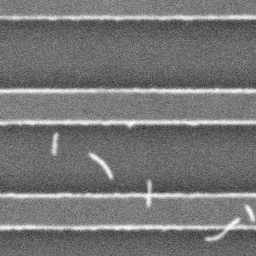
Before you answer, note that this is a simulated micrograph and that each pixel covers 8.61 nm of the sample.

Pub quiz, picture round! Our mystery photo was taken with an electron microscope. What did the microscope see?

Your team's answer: lines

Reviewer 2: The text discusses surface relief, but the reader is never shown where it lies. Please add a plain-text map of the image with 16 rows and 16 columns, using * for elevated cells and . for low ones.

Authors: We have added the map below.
****************
................
................
................
................
................
****************
****************
................
................
................
................
****************
****************
................
................